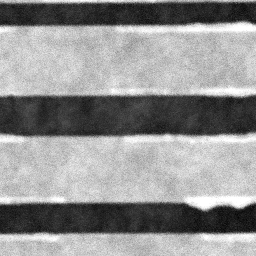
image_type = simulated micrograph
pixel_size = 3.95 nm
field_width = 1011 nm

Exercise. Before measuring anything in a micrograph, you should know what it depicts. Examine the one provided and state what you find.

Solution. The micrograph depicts one or a few lines or trenches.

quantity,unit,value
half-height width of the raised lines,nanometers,266